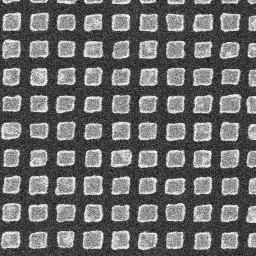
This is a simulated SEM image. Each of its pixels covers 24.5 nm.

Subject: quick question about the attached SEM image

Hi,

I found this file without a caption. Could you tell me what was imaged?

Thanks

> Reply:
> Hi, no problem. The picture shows a regular array of raised bodies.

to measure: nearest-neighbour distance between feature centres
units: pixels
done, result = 26.7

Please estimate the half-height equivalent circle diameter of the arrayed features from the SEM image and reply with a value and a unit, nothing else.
446 nm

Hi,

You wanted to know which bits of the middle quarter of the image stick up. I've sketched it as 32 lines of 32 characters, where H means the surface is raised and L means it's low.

LLLLLLLLLLLLLLLLLLLLLLLLLLLLLLLL
HHHLLLHHHLLLLHLHLLLLHHHLLLHHHHLL
HHHLLHHHHLLLHHHHLLLHHHHLLLHHHHLL
HHHLLHHHHLLLHHHHLLLHHHHLLLHHHHLL
HHHLLHHHHLLLHHHHLLLHHHHLLLHHHHLL
LLLLLLLLLLLLLLLLLLLLLLLLLLLLLLLL
LLLLLLLLLLLLLLLLLLLLLLLLLLLLLLLL
LLLLLLLLLLLLLLLLLLLLLLLLLLLLLLLL
HHLLLLHHHLLLHHHHLLLLHHHLLLHHHHLL
HHLLLLHHHLLLHHHHLLLHHHHLLLHHHHLL
HHLLLHHHHLLLHHHHLLLHHHHLLLHHHHLL
HHLLLHHHHLLLHHHHLLLHHHHLLLHHHHLL
LLLLLLLLLLLLLLLLLLLLLLLLLLLLLLLL
LLLLLLLLLLLLLLLLLLLLLLLLLLLLLLLL
LLLLLLLLLLLLLLLLLLLLLLLLLLLLLLLL
HHHLLLHHHLLLHHHHLLLHHHHLLLHHHHLL
HHLLLLHHHLLLHHHHLLLHHHHLLLHHHHLL
HHLLLHHHHLLLHHHHLLLHHHHLLLHHHHLL
HHLLLHHLLLLLHHHHLLLHHHLLLLHHHHLL
LLLLLLLLLLLLLLLLLLLLLLLLLLLLLLLL
LLLLLLLLLLLLLLLLLLLLLLLLLLLLLLLL
LLLLLLLLHLLLLLLLLLLLLLLLLLLLLLLL
HHLLLLHHHLLLHHHHHLLHHHHLLLHHHHLL
HHLLLHHHHLLLHHHHHLLHHHHLLLHHHHLL
HHLLLHHHHLLLHHHHLLLHHHHLLLHHHHLL
LLLLLHHHHLLLHLLLLLLHHHLLLLHHLHLL
LLLLLLLLLLLLLLLLLLLLLLLLLLLLLLLL
LLLLLLLLLLLLLLLLLLLLLLLLLLLLLLLL
LLLLLLHHHLLLLLLHLLLLLHLLLLLLLLLL
HHHLLHHHHLLLHHHHLLLHHHHLLLHHHHLL
HHLLLHHHHLLLHHHHLLLHHHHLLLHHHHLL
HHLLLHHHHLLLHHHHLLLHHHHLLHHHHHLL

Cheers